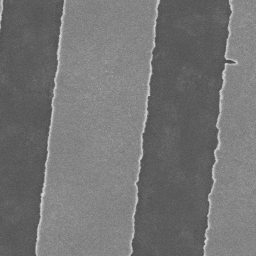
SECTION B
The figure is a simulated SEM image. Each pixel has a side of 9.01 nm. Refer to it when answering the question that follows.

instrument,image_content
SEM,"one or a few lines or trenches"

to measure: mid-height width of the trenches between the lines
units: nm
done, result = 660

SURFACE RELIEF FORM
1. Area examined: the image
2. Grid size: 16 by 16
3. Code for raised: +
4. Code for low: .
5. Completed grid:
....++++++....++
....++++++....++
....++++++....++
....+++++.....++
....+++++.....++
...++++++.....++
...++++++.....++
...++++++.....++
...++++++.....++
...++++++.....++
...++++++....+++
...++++++....+++
...++++++....+++
...+++++.....+++
..++++++.....+++
..++++++.....+++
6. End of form